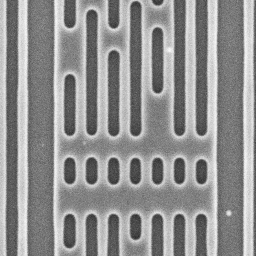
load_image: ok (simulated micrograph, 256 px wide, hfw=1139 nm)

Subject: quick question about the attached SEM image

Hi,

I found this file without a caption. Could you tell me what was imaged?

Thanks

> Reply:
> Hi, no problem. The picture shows groups of lines, slits or small figures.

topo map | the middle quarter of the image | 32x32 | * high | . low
*****....**...**....**...**....*
*****....**...**....**...**....*
*.***....**...**....**...**....*
...**....**...**....**...**....*
...**....**...**....**...**....*
...**....**...**....**...**....*
...**....**...**....**...**....*
...**....**...**....***.***....*
...**....**...**....*******....*
...**....**...**....*******....*
...**....**...**....*******....*
...**....**...**....*******....*
...**....**...**....*******....*
...**....**...**....*******....*
...**....**...**....*******....*
...**...***...**....*******....*
...**...***...**....*******....*
...***..***...***..*********..**
********************************
********************************
********************************
********************************
********************************
*.****..****.**********.****.***
...**...***...***..***...***..**
...**....**...**...***...**....*
...**....**...**...***...**....*
...**....**...**...***...**....*
...**....**...**...***...**...**
...***..***...***..***...***..**
********************************
********************************